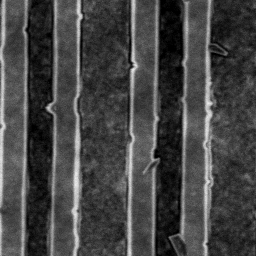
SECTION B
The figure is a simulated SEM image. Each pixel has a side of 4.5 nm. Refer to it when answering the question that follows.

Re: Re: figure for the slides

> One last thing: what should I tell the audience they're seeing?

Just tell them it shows one or a few lines or trenches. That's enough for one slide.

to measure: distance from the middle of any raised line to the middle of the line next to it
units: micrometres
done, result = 0.282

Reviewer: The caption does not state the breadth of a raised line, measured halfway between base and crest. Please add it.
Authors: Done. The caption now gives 111 nanometres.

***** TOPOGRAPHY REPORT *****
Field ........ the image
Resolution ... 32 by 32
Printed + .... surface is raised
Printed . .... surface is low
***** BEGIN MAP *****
+++....+++.......+++...+++......
+++....+++.......+++...+++......
+++....+++.......+++...+++......
+++....+++.......+++...+++......
+++....+++.......+++...+++......
+++....+++.......+++...++++.....
+++....+++.......+++...+++++....
+++....+++.......+++...+++......
+++....+++.......+++...+++......
+++....+++.......+++...+++......
+++....+++.......+++...+++......
+++....+++......+++....+++......
+++....+++......+++....+++......
+++...+++.......+++....+++......
+++....+++......++++...+++......
+++....+++......++++...+++......
+++....+++......+++....+++......
+++....+++.......++....+++......
+++....+++......+++....+++......
+++....+++......+++....+++......
+++....+++......++++...+++......
+++....+++......+++....+++......
+++....+++......+++....+++......
+++....+++......+++....+++......
+++....+++......+++....+++......
+++....+++......+++....+++......
+++....+++......+++....+++......
+++...++++......+++....+++......
+++...++++......+++....+++......
+++...++++......+++..+++++......
+++...++++......+++...++++......
+++...+++.......+++...++++......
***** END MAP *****